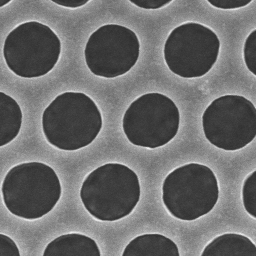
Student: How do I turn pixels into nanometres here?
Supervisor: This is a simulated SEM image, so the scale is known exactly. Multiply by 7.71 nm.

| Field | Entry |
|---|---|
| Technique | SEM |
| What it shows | a regular array of holes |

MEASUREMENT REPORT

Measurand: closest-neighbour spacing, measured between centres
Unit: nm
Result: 614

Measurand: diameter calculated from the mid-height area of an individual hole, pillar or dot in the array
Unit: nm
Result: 436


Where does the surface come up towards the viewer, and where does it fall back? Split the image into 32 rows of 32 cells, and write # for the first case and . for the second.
.######....######....#####.....#
################################
################################
##....######....######....######
#......####......####......####.
........###......####......####.
........###......###.......####.
#......####......####......####.
#......####.....#####.....#####.
##...########..#######...#######
################################
################################
..#####....######....######....#
...###......####......####......
...##........###......###.......
...##........##.......###.......
..###.......####......####......
..####......####.....#####......
#######...##################..##
################################
###..########..#########.#######
#......#####.....#####.....#####
.......####......####......####.
........##.......###.......###..
........##.......###.......###..
#......###.......####......###..
#.....#####.....#####.....#####.
#############..########.########
################################
.#######...######...#######....#
..####......####......####......
..####.......##.......###.......